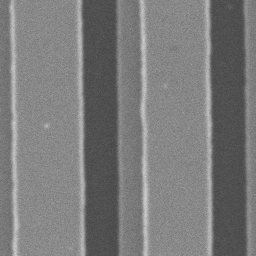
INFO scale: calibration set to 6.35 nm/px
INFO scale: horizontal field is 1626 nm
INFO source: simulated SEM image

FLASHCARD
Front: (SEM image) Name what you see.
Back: lines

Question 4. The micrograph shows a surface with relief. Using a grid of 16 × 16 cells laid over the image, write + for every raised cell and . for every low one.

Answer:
+++++..++++++..+
+++++..++++++..+
+++++..++++++..+
+++++..++++++..+
+++++..++++++..+
+++++..++++++..+
+++++..++++++..+
+++++..++++++..+
+++++..++++++..+
+++++..++++++..+
+++++..++++++..+
+++++..++++++..+
+++++..++++++..+
+++++..++++++..+
+++++..++++++..+
+++++..++++++..+